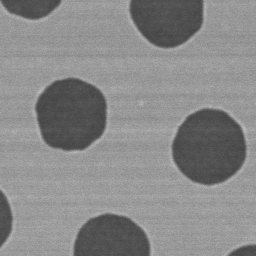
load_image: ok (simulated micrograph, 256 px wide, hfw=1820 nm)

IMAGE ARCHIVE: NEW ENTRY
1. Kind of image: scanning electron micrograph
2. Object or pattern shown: holes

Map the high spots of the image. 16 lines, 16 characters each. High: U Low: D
DDDDUUUUDDDDDUUU
UUUUUUUUDDDDDUUU
UUUUUUUUUDDDUUUU
UUUUUUUUUUUUUUUU
UUUUUUUUUUUUUUUU
UUUDDDUUUUUUUUUU
UUDDDDDUUUUUUUUU
UUDDDDDUUUUUDDDU
UUUDDDUUUUUDDDDU
UUUUUUUUUUUDDDDU
UUUUUUUUUUUDDDDU
UUUUUUUUUUUUDDUU
UUUUUUUUUUUUUUUU
DUUUUUDDUUUUUUUU
DUUUUDDDDUUUUUUU
UUUUUDDDDUUUUUUD